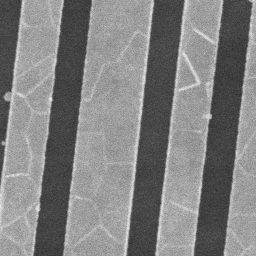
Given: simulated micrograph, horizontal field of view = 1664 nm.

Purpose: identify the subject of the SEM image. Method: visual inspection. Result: lines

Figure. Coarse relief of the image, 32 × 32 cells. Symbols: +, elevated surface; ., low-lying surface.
...+++++...++++++++....+++++....
...+++++...++++++++....+++++....
...+++++...++++++++....+++++...+
..+++++....++++++++....++++....+
..+++++....++++++++....++++....+
..+++++....++++++++...+++++....+
..+++++....+++++++....+++++....+
..+++++....+++++++....+++++....+
..+++++....+++++++....+++++....+
..+++++...++++++++....+++++....+
..+++++...++++++++....+++++...++
..+++++...++++++++....++++....++
.+++++....++++++++....++++....++
.+++++....++++++++....++++....++
.+++++....++++++++...+++++....++
.+++++....+++++++....+++++....++
.+++++....+++++++....+++++....++
.+++++....+++++++....+++++....++
.+++++...++++++++....+++++....++
.+++++...++++++++....+++++....++
.+++++...++++++++....++++....+++
+++++....++++++++....++++....+++
+++++....++++++++....++++....+++
+++++....++++++++...+++++....+++
+++++....++++++++...+++++....+++
+++++....+++++++....+++++....+++
+++++....+++++++....+++++....+++
+++++...++++++++....+++++....+++
+++++...++++++++....++++....++++
++++....++++++++....++++....++++
++++....++++++++....++++....++++
++++....++++++++....++++....++++